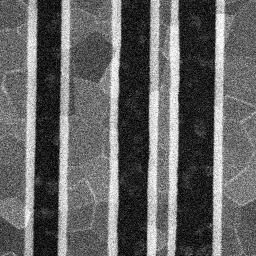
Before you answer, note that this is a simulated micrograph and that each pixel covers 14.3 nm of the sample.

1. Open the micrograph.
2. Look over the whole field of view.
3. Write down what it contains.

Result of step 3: one or a few lines or trenches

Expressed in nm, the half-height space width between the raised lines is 571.